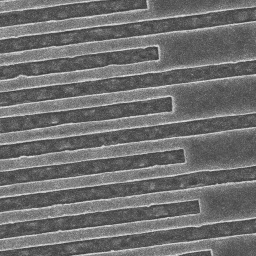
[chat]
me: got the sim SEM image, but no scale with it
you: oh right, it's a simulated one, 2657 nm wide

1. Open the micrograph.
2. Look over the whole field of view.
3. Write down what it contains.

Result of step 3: parallel lines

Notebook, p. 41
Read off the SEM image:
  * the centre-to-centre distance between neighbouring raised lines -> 272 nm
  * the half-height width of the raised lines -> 124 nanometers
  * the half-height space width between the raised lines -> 152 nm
